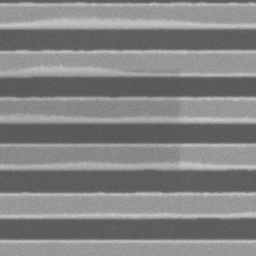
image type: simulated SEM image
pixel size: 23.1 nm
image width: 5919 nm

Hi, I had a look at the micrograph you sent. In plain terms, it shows lines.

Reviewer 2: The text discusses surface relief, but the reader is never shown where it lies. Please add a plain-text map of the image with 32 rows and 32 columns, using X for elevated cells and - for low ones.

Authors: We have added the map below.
XXXXXXXXXXXXXXXXXXXXXXXXXXXXXXXX
XXXXXXXXXXXXXXXXXXXXXXXXXXXXXXXX
XXXXXXXXXXXXXXXXXXXXXXXXXXXXXXXX
--------------------------------
--------------------------------
--------------------------------
XXXXXXXXXXXXXXXXXXXXXXXXXXXXXXXX
XXXXXXXXXXXXXXXXXXXXXXXXXXXXXXXX
XXXXXXXXXXXXXXXXXXXXXXXXXXXXXXXX
-------------------XXXXXXXXXXXX-
--------------------------------
--------------------------------
XXXXXXXXXXXXXXXXXXXXXXXXXXXXXXXX
XXXXXXXXXXXXXXXXXXXXXXXXXXXXXXXX
XXXXXXXXXXXXXXXXXXXXXXXXXXXXXXXX
--------------------------------
--------------------------------
--------------------------------
XXXXXXXXXXXXXXXXXXXXXXXXXXXXXXXX
XXXXXXXXXXXXXXXXXXXXXXXXXXXXXXXX
XXXXXXXXXXXXXXXXXXXXXXXXXXXXXXXX
--------------------------------
--------------------------------
--------------------------------
XXXXXXXXXXXXXXXXXXXXXXXXXXXXXXXX
XXXXXXXXXXXXXXXXXXXXXXXXXXXXXXXX
XXXXXXXXXXXXXXXXXXXXXXXXXXXXXXXX
--------------------------------
--------------------------------
--------------------------------
XXXXXXXXXXXXXXXXXXXXXXXXXXXXXXXX
XXXXXXXXXXXXXXXXXXXXXXXXXXXXXXXX